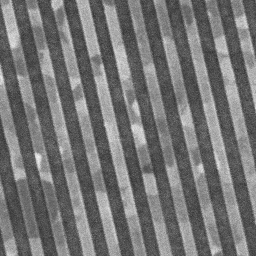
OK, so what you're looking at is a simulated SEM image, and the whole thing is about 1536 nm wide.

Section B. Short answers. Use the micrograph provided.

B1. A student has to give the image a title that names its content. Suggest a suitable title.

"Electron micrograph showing parallel lines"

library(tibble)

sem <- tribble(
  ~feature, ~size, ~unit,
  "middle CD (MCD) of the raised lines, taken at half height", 63.6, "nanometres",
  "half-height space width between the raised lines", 87.1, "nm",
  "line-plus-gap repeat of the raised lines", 150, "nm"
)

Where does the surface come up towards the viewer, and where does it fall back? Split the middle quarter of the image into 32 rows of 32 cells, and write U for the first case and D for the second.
DUUDDDDUUUDDDDUUDDDDUUDDDDUUUDDD
DUUUDDDUUUDDDDUUDDDDUUUDDDUUUDDD
DUUUDDDDUUDDDDUUDDDDUUUDDDDUUDDD
DUUUDDDDUUDDDDUUUDDDUUUDDDDUUUDD
DDUUDDDDUUDDDDUUUDDDDUUDDDDUUUDD
DDUUDDDDUUUDDDUUUDDDDUUUDDDUUUDD
DDUUUDDDDUUDDDDUUDDDDUUUDDDDUUDD
DDUUUDDDDUUDDDDUUUDDDUUUDDDDUUDD
DDDUUDDDDUUDDDDUUUDDDDUUDDDDUUUD
DDDUUDDDDUUUDDDUUUDDDDUUDDDDUUUD
DDDUUUDDDUUUDDDDUUDDDDUUUDDDDUUD
DDDUUUDDDUUUDDDDUUUDDDUUUDDDDUUD
DDDUUUDDDDUUDDDDUUUDDDDUUDDDDUUU
DDDDUUDDDDUUUDDDUUUDDDDUUDDDDUUU
DDDDUUUDDDUUUDDDDUUDDDDUUUDDDUUU
DDDDUUUDDDUUUDDDDUUDDDDUUUDDDDUU
UDDDUUUDDDDUUDDDDUUUDDDUUUDDDDUU
UDDDDUUDDDDUUDDDDUUUDDDDUUDDDDUU
UDDDDUUDDDDUUUDDDUUUDDDDUUUDDDUU
UDDDDUUUDDDUUUDDDDUUDDDDUUUDDDDU
UDDDDUUUDDDUUUDDDDUUUDDDUUUDDDDU
UUDDDDUUDDDDUUDDDDUUUDDDDUUDDDDU
UUDDDDUUDDDDUUUDDDUUUDDDDUUDDDDU
UUDDDDUUUDDDUUUDDDDUUDDDDUUUDDDU
UUDDDDUUUDDDUUUDDDDUUUDDDUUUDDDD
UUUDDDUUUDDDDUUDDDDUUUDDDUUUDDDD
UUUDDDDUUDDDDUUDDDDDUUDDDDUUDDDD
UUUDDDDUUDDDDUUUDDDDUUDDDDUUUDDD
DUUDDDDUUUDDDDUUDDDDUUUDDDUUUDDD
DUUUDDDUUUDDDDUUDDDDUUUDDDUUUDDD
DUUUDDDDUUDDDDUUDDDDUUUDDDDUUDDD
DUUUDDDDUUDDDDUUUDDDUUUDDDDUUUDD